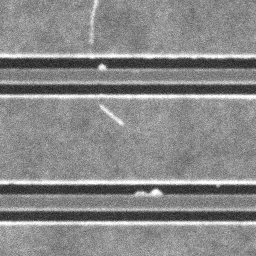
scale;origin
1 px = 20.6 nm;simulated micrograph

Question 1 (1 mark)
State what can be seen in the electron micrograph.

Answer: lines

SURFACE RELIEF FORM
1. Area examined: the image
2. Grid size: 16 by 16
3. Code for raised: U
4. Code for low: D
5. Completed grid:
UUUUUUUUUUUUUUUU
UUUUUUUUUUUUUUUU
UUUUUUUUUUUUUUUU
UUUUUUUUUUUUUUUU
DDDDDDDDDDDDDDDD
DDDDDDDDDDDDDDDD
UUUUUUUUUUUUUUUU
UUUUUUUUUUUUUUUU
UUUUUUUUUUUUUUUU
UUUUUUUUUUUUUUUU
UUUUUUUUUUUUUUUU
DDDDDDDDDDDDDDDD
DDDDDDDDDDDDDDDD
DDDDDDDDDDDDDDDD
UUUUUUUUUUUUUUUU
UUUUUUUUUUUUUUUU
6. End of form